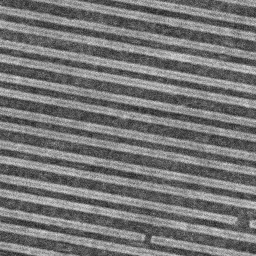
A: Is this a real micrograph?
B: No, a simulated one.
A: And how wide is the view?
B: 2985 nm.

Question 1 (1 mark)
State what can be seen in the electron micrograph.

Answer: parallel lines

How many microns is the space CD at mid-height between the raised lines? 0.11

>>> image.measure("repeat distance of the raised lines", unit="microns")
0.193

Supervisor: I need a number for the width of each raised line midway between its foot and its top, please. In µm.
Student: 0.066